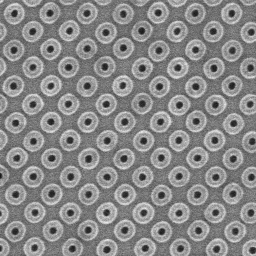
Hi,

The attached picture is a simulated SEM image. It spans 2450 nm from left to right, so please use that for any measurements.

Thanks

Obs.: a regular array of ring-shaped raised bodies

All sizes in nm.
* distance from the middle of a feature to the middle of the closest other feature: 239